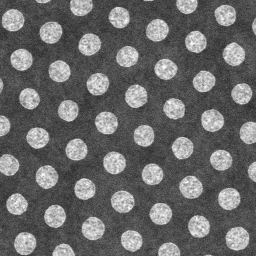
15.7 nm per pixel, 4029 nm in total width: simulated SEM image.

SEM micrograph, a regular array of raised bodies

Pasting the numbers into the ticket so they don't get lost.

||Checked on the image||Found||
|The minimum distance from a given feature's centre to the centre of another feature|0.626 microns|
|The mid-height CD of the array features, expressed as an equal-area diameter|332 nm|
